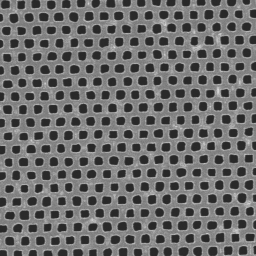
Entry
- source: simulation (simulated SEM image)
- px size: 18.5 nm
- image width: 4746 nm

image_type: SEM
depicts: a regular array of holes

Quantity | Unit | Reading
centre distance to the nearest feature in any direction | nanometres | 271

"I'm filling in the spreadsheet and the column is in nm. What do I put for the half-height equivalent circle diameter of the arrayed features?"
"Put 172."